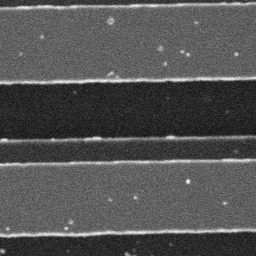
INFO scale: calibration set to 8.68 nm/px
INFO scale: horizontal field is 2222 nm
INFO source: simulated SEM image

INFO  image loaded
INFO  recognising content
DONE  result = lines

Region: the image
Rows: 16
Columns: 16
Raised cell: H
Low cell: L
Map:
LHHHHHHHHHHHHHHH
HHHHHHHHHHHHHHHH
HHHHHHHHHHHHHHHH
HHHHHHHHHHHHHHHH
HHHHHHHHHHHHHHHH
LLLLLLLLLLLLLLLL
LLLLLLLLLLLLLLLL
LLLLLLLLLLLLLLLL
LLLLLLLLLLLLLLLL
LLLLLLLLLLLLLLLL
HHHHHHHHHHHHHHHH
HHHHHHHHHHHHHHHH
HHHHHHHHHHHHHHHH
HHHHHHHHHHHHHHHH
HHHHHHHHHHHHHLLL
LLLLLLLLLLLLLLLL